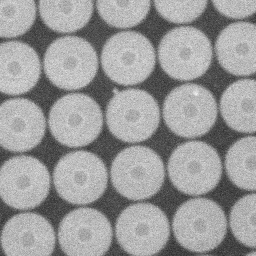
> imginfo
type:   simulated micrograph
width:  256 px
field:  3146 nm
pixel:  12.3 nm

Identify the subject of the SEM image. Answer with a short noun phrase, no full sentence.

an array of small figures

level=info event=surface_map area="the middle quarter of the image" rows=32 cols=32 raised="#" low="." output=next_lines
####....##.....##.....###.......
###.....##............###.......
.......####..........######.....
.......#####........#########...
......########....##############
....##########################..
############################....
##############.......######.....
......#######.........####......
.......#####...........###.....#
........###............##.....##
.........##.....###....##....###
..##.....##....####.....#....###
.####....##....####.....#.....##
.####....##....####....###......
.###.....##............###......
.........###..........#####.....
........#####.........#######...
.......#######......############
......##########################
##############################..
################.....#######....
##....########.........####.....
........#####..........####.....
.........####...........###....#
..........##.....###....##.....#
...##.....##....#####....#....##
..####....##....#####....#.....#
..####....##.....###.....##.....
..####....##............###.....
...##.....###...........####....
..........####.........######...